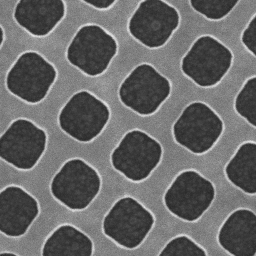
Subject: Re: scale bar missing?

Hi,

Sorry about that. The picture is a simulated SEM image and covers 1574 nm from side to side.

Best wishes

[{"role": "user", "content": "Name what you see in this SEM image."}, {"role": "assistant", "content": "a regular array of holes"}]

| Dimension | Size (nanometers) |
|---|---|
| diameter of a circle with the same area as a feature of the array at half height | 295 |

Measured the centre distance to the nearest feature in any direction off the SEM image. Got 0.403 micrometres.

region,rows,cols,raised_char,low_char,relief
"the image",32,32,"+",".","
++......+++...+++....+++.....+++
++......+++++++++.....+++....+++
++......++++++++......+++++++++.
+++....+++...+++......+++++++++.
+++++++++.....+++....+++++++++..
+++++++++......+++..++++....++..
++++++++.......++++++++......++.
++....+++.....+++++++++......+++
+......+++...++++..++++......+++
+......+++++++++....+++.....++++
+......++++++++......++++..++++.
+.....++++.++++......+++++++++..
+++..++++...+++......++++++++...
++++++++.....+++....+++...+++...
+++++++.......+++++++++....+++..
+...+++......+++++++++......+++.
+.....++.....+++..++++......++++
......++++.++++....+++.....+++++
......++++++++......+++...++++..
.....+++++++++......+++++++++...
+...++++...+++......++++++++....
+++++++.....+++....++++.++++....
+++++++......+++..++++....+++...
+..+++......+++++++++......+++..
....+++.....+++++++++......+++++
.....+++...+++....+++.....++++++
.....+++++++++.....++.....+++..+
....+++++++++......++++.++++....
....+++..++++......+++++++++....
+.++++.....++.....+++++++++.....
++++++......+++..++++....+++....
+++++......+++++++++......++....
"